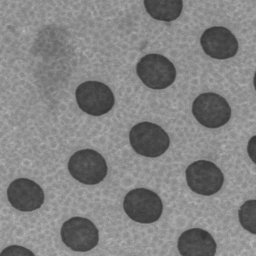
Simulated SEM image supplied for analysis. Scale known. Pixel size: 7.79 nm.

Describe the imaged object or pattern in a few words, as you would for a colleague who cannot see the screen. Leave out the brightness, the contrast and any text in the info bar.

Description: a regular array of holes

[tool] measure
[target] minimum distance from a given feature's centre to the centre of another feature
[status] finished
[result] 522 nm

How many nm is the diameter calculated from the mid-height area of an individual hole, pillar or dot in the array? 293